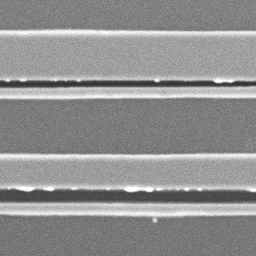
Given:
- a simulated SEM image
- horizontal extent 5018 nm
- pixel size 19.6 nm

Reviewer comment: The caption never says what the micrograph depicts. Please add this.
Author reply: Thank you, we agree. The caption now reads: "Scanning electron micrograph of lines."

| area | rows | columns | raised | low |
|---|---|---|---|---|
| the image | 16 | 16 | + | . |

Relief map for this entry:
................
................
++++++++++++++++
++++++++++++++++
++++++++++++++++
++++++++++++++++
................
................
................
................
++++++++++++++++
++++++++++++++++
................
................
................
................